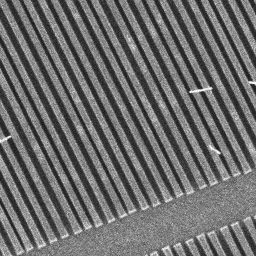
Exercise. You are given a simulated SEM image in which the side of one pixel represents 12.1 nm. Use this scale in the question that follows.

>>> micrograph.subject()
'parallel lines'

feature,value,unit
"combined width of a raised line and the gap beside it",12.1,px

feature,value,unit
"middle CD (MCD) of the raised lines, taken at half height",82.7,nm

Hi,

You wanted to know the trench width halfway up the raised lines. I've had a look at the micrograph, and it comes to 62.4 nanometers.